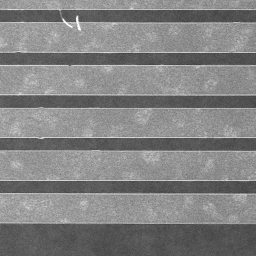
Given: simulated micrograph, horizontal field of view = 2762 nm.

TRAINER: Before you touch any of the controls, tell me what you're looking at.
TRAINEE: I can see parallel lines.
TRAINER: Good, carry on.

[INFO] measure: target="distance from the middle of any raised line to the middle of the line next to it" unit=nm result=461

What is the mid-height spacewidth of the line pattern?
140 nm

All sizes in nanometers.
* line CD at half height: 320